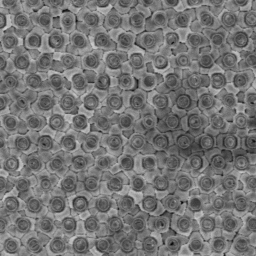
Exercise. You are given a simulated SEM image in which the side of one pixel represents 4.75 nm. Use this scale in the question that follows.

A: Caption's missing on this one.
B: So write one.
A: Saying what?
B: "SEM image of a regular array of raised bodies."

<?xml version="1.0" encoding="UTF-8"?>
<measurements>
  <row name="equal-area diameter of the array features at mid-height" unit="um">0.0554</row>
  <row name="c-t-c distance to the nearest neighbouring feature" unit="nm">57.4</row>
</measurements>